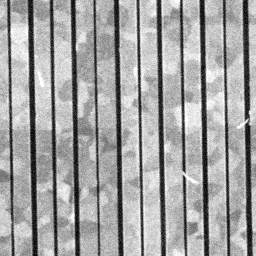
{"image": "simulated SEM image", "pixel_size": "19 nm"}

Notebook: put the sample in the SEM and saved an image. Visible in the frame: parallel lines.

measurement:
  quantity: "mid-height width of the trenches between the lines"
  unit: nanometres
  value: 90.3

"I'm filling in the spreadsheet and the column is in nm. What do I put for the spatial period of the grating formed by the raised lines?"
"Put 409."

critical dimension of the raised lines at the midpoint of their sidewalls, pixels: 17.1